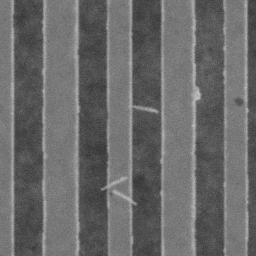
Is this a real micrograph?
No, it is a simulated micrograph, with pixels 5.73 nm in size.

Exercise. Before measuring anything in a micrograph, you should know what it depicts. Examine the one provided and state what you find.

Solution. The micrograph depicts lines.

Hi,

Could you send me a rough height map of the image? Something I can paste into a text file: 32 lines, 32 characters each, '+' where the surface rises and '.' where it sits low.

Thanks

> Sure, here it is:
++....++++...+++....++++....+++.
++....++++...+++....++++....+++.
++....++++...+++....++++....+++.
++....++++...+++....++++....+++.
++....++++...+++....++++....+++.
++....++++...+++....++++....+++.
++....+++....+++....++++....+++.
++....++++...+++....++++....+++.
++....++++...+++....++++....+++.
++....++++...+++....++++....+++.
++....++++...+++....++++....+++.
++....++++...+++....++++....+++.
++....++++...+++....++++....+++.
++...+++++...+++....++++....+++.
++....++++....++....++++....+++.
++....++++...+++....++++....+++.
++....++++...+++....++++....+++.
++....++++...+++....++++....+++.
++....++++...+++....++++....+++.
++....++++....++....++++....+++.
++....+++....+++....++++....+++.
++....++++...+++....++++....+++.
++....++++...+++....++++....+++.
++...+++++...+++....++++....+++.
++...+++++...+++....++++....+++.
++....++++...++++...++++....+++.
++....++++....++....++++....+++.
++....++++....++....++++....+++.
++....++++....++....++++....+++.
++...+++++....++....++++....+++.
++...+++++....++....++++....+++.
++....++++....++....++++....+++.